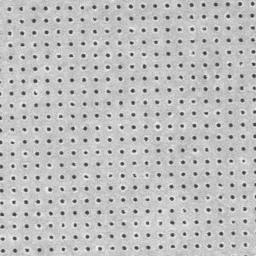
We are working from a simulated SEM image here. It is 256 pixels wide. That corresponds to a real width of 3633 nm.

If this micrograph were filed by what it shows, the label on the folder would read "a regular array of holes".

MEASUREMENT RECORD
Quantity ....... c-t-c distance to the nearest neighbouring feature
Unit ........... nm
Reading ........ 168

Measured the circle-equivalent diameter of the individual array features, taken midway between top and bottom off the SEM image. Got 62 nm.